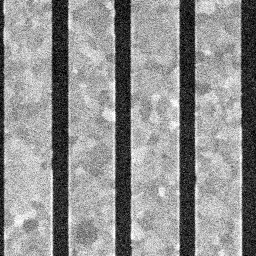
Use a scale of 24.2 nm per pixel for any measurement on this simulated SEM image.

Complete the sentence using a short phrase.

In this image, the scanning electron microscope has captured lines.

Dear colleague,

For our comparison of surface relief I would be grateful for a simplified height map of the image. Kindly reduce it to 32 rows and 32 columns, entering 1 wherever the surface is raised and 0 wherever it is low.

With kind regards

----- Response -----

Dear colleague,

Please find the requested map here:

01111100011111001111110011111100
01111100011111001111110011111100
01111100011111001111110011111100
01111100011111001111110011111100
01111100011111001111110011111100
01111100011111001111110011111100
01111100011111001111110011111100
01111100011111001111110011111100
01111100011111001111110011111100
01111100011111001111110011111100
01111100011111001111110011111100
01111100011111001111110011111100
01111100011111001111110011111100
01111100011111001111110011111100
01111100011111001111110011111100
01111100011111001111110011111100
01111100011111001111110011111100
01111100011111001111110011111100
01111100011111001111110011111100
01111100011111001111110011111100
01111100011111001111110011111100
01111100011111001111110011111100
01111100011111001111110001111100
01111100011111000111110011111100
01111100011111001111110011111100
01111100011111001111110011111100
01111100011111001111110011111100
01111100011111001111110011111100
01111100011111000111110001111100
01111100011111001111110011111100
01111100011111000111110011111100
01111100011111000111110011111100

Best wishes